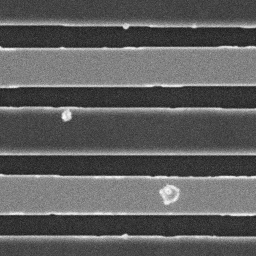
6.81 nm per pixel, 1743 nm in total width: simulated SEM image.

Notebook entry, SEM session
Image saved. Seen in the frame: lines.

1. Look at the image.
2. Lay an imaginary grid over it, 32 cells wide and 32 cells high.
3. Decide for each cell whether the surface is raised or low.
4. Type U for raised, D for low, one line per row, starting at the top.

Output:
UUUUUUUUUUUUUUUUUUUUUUUUUUUUUUUU
UUUUUUUUUUUUUUUUUUUUUUUUUUUUUUUU
UUUUUUUUUUUUUUUUUUUUUUUUUUUUUUUU
DDDDDDDDDDDDDDDDDDDDDDDDDDDDDDDD
DDDDDDDDDDDDDDDDDDDDDDDDDDDDDDDD
DDDDDDDDDDDDDDDDDDDDDDDDDDDDDDDD
UUUUUUUUUUUUUUUUUUUUUUUUUUUUUUUU
UUUUUUUUUUUUUUUUUUUUUUUUUUUUUUUU
UUUUUUUUUUUUUUUUUUUUUUUUUUUUUUUU
UUUUUUUUUUUUUUUUUUUUUUUUUUUUUUUU
UUUUUUUUUUUUUUUUUUUUUUUUUUUUUUUU
DDDDDDDDDDDDDDDDDDDDDDDDDDDDDDDD
DDDDDDDDDDDDDDDDDDDDDDDDDDDDDDDD
UUUUUUUUUUDDDDDDDDDDDDDDDDDDDDDD
UUUUUUUUUUUUUUUUUUUUUUUUUUUUUUUU
UUUUUUUUUUUUUUUUUUUUUUUUUUUUUUUU
UUUUUUUUUUUUUUUUUUUUUUUUUUUUUUUU
UUUUUUUUUUUUUUUUUUUUUUUUUUUUUUUU
UUUUUUUUUUUUUUUUUUUUUUUUUUUUUUUU
DDDDDDDDDDDDDDDDDDDDDDDDDDDDDDDD
DDDDDDDDDDDDDDDDDDDDDDDDDDDDDDDD
DDDDDDDDDDDDDDDDDDDDDDDDDDDDDDDD
UUUUUUUUUUUUUUUUUUUUUUUUUUUUUUUU
UUUUUUUUUUUUUUUUUUUUUUUUUUUUUUUU
UUUUUUUUUUUUUUUUUUUUUUUUUUUUUUUU
UUUUUUUUUUUUUUUUUUUUUUUUUUUUUUUU
UUUUUUUUUUUUUUUUUUUUUUUUUUUUUUUU
DDDDDDDDDDDDDDDDDDDDDDDDDDDDDDDD
DDDDDDDDDDDDDDDDDDDDDDDDDDDDDDDD
DDDDDDDDDDDDDDDUDDDDDDDDDDDDDDDD
UUUUUUUUUUUUUUUUUUUUUUUUUUUUUUUU
UUUUUUUUUUUUUUUUUUUUUUUUUUUUUUUU